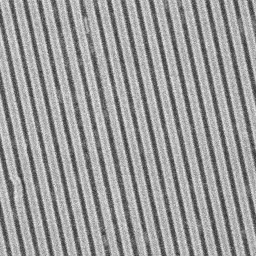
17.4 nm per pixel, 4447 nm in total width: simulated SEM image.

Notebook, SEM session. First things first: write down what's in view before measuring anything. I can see parallel lines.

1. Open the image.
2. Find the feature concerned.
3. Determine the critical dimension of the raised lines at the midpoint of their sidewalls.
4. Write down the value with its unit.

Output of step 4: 127 nm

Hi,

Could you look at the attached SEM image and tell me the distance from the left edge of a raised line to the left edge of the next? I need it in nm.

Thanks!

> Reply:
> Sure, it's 238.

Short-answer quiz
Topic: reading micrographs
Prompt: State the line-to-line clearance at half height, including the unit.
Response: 110 nm